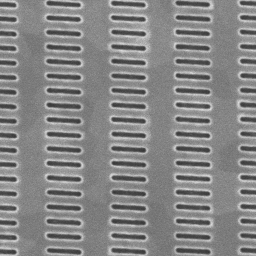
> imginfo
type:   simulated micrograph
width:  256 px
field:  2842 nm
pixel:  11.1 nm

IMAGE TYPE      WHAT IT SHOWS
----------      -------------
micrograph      a regular array of holes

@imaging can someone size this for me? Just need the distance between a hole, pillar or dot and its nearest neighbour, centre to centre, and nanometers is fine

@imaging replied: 159